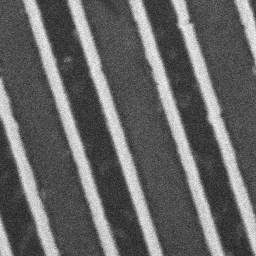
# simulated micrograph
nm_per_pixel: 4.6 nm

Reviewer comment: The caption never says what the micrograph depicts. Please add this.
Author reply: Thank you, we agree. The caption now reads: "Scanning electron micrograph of one or a few lines or trenches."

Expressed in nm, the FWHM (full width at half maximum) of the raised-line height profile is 201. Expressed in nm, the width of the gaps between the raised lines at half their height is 264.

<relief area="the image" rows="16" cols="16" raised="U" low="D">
DDUUUDDDDUUDDDDU
DDUUUDDDDUUUDDDD
DDDUUDDDDUUUDDDD
DDDUUUDDDDUUDDDD
DDDUUUDDDDUUUDDD
DDDDUUDDDDUUUDDD
DDDDUUUDDDUUUDDD
UDDDUUUDDDDUUUDD
UDDDDUUDDDDUUUDD
UDDDDUUUDDDDUUDD
UUDDDUUUDDDDUUUD
UUDDDUUUDDDDUUUD
UUDDDDUUUDDDUUUD
UUUDDDUUUDDDDUUU
UUUDDDUUUDDDDUUU
UUUDDDDUUUDDDUUU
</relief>